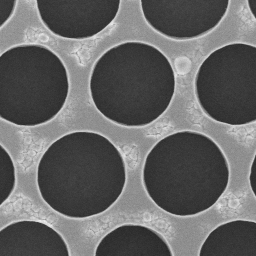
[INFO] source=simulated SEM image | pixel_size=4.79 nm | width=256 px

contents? holes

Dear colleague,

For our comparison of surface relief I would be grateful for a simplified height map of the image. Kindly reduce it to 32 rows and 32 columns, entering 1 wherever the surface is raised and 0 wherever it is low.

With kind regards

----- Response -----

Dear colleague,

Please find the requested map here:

00111000000000011100000000001110
00111000000000011100000000001110
01111000000000111100000000001111
11111100000001111110000000011111
11111111000111111111100001111111
11111111111111100011111111111011
10000011111110000000111111100000
00000000111100000000011111000000
00000000111100000000011110000000
00000000111000000000001110000000
00000000111000000000001100000000
00000000111000000000001110000000
00000000111100000000011110000000
00000000111100000000011110000000
00000001111110000000111111000000
11000111111111100011111111110001
11111111111111111111111011111111
11111110000000111111000000111111
11111100000000111110000000011111
01111000000000011100000000001111
00111000000000011100000000001111
00111000000000001100000000000110
00111000000000001100000000000110
00111000000000011100000000001110
01111000000000011110000000001111
11111100000000111111000000011111
11111110000001111111100001111111
11111111111111111111111111111111
10000011111111100011111111100000
00000000111110000000111111000000
00000000111110000000011110000000
00000000111100000000011110000000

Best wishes